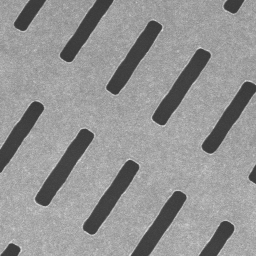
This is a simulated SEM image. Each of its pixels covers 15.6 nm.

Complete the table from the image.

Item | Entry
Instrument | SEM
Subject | holes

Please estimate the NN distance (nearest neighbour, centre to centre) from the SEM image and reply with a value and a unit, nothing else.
867 nanometres